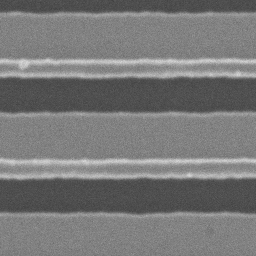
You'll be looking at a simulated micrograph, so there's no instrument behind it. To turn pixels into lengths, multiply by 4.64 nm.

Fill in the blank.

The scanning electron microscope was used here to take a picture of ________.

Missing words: lines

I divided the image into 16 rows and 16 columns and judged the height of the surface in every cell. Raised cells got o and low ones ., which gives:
................
oooooooooooooooo
oooooooooooooooo
oooooooooooooooo
oooooooooooooooo
................
................
oooooooooooooooo
oooooooooooooooo
oooooooooooooooo
oooooooooooooooo
................
................
oooooooooooooooo
oooooooooooooooo
oooooooooooooooo